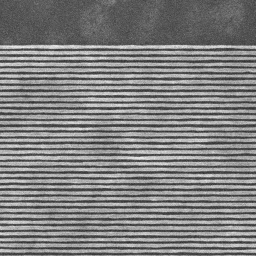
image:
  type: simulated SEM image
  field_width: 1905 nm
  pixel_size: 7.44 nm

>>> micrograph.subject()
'parallel lines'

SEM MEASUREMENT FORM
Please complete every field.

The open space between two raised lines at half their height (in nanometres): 19.5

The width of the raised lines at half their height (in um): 0.0195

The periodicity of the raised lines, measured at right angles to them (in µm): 0.0433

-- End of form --